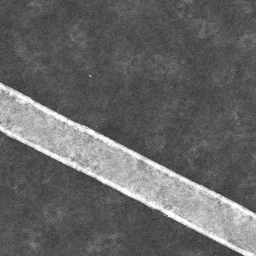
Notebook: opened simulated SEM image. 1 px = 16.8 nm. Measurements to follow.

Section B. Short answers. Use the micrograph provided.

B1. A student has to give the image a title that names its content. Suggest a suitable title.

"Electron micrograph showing one or a few lines or trenches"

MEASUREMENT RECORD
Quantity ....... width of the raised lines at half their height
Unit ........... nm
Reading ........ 611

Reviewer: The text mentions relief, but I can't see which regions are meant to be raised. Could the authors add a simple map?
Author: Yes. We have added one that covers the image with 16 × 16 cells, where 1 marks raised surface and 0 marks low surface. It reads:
0000000000000000
0000000000000000
0000000000000000
0000000000000000
0000000000000000
0000000000000000
1100000000000000
1111000000000000
0111110000000000
0001111100000000
0000011111000000
0000000111110000
0000000001111100
0000000000011111
0000000000000111
0000000000000001